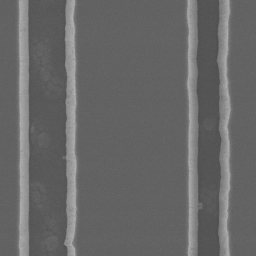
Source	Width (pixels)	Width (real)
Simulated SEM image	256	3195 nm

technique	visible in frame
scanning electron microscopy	one or a few lines or trenches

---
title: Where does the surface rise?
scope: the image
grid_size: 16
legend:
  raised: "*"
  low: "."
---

*...********..**
*...********..**
*...********..**
**..********..**
**..********..**
**..********..**
**..********..**
**..********..**
**..********..**
**..********..**
**..********..**
**..********..**
**..********..**
**..********..**
**..********..**
**..********..**